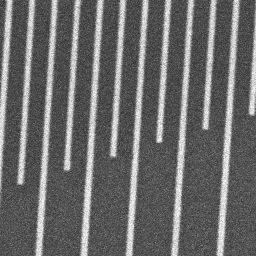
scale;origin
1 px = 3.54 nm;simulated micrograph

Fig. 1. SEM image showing parallel lines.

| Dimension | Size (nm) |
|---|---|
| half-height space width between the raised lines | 64.9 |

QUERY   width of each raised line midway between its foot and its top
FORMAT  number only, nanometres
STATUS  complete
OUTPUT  16.3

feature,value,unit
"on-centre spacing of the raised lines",0.0802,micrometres